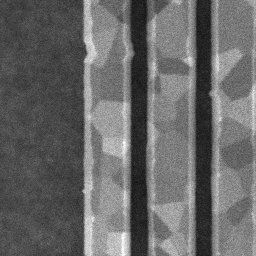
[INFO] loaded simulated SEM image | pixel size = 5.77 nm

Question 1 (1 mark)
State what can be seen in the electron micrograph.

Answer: one or a few lines or trenches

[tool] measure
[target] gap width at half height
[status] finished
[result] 126 nm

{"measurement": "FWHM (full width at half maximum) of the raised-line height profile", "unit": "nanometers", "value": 242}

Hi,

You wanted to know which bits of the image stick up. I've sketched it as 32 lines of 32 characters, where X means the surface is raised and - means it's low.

-----------XXXXX---XXXXX---XXXXX
-----------XXXXX---XXXXX---XXXXX
-----------XXXXX---XXXXX---XXXXX
-----------XXXXX---XXXXX---XXXXX
-----------XXXXX---XXXXX---XXXXX
-----------XXXXX---XXXXX---XXXXX
-----------XXXXX---XXXXX---XXXXX
-----------XXXXX---XXXXX---XXXXX
-----------XXXXX---XXXXX---XXXXX
-----------XXXXX---XXXXX---XXXXX
-----------XXXXX---XXXXX---XXXXX
-----------XXXXX---XXXXX---XXXXX
-----------XXXXX---XXXXX---XXXXX
-----------XXXXX---XXXXX---XXXXX
-----------XXXXX---XXXXX---XXXXX
-----------XXXXX---XXXXX---XXXXX
-----------XXXXX---XXXXX---XXXXX
-----------XXXXX---XXXXX---XXXXX
-----------XXXXX---XXXXX---XXXXX
-----------XXXXX---XXXXX---XXXXX
-----------XXXXX---XXXXX---XXXXX
-----------XXXXX---XXXXX---XXXXX
-----------XXXXX---XXXXX---XXXXX
-----------XXXXX---XXXXX---XXXXX
-----------XXXXX---XXXXX---XXXXX
-----------XXXXX---XXXXX---XXXXX
-----------XXXXX---XXXXX---XXXXX
-----------XXXXX---XXXXX---XXXXX
-----------XXXXX---XXXXX---XXXXX
-----------XXXXX---XXXXX---XXXXX
-----------XXXXX---XXXXX---XXXXX
-----------XXXXX---XXXXX---XXXXX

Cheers